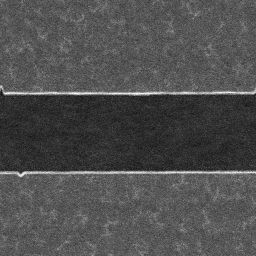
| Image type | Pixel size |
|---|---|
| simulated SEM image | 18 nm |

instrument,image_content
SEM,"one or a few lines or trenches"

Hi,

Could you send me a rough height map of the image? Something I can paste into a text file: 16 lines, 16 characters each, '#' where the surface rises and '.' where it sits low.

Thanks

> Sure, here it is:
################
################
################
################
################
################
................
................
................
................
................
################
################
################
################
################